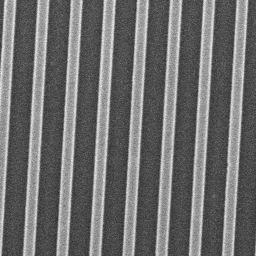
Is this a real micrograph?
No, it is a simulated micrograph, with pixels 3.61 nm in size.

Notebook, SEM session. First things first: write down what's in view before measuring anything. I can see parallel lines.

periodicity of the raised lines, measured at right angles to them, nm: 119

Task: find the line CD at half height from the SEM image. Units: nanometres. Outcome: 36.4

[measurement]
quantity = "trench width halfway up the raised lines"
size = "81.9 nanometers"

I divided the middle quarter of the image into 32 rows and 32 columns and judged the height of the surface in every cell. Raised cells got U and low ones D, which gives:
DUUDDDDDDUUUDDDDDDUUDDDDDDUUDDDD
DUUDDDDDDUUUDDDDDDUUDDDDDDUUDDDD
DUUDDDDDDUUUDDDDDUUUDDDDDDUUDDDD
DUUDDDDDDUUUDDDDDUUUDDDDDDUUDDDD
DUUDDDDDDUUUDDDDDUUUDDDDDDUUDDDD
DUUDDDDDDUUUDDDDDUUUDDDDDDUUDDDD
DUUDDDDDDUUDDDDDDUUUDDDDDDUUDDDD
DUUDDDDDDUUDDDDDDUUUDDDDDUUUDDDD
DUUDDDDDDUUDDDDDDUUUDDDDDUUUDDDD
DUUDDDDDDUUDDDDDDUUDDDDDDUUUDDDD
DUUDDDDDDUUDDDDDDUUDDDDDDUUUDDDD
UUUDDDDDDUUDDDDDDUUDDDDDDUUUDDDD
UUUDDDDDDUUDDDDDDUUDDDDDDUUUDDDD
UUUDDDDDDUUDDDDDDUUDDDDDDUUUDDDD
UUUDDDDDUUUDDDDDDUUDDDDDDUUUDDDD
UUUDDDDDUUUDDDDDDUUDDDDDDUUDDDDD
UUDDDDDDUUUDDDDDDUUDDDDDDUUDDDDD
UUDDDDDDUUUDDDDDUUUDDDDDDUUDDDDD
UUDDDDDDUUUDDDDDUUUDDDDDDUUDDDDD
UUDDDDDDUUUDDDDDUUUDDDDDDUUDDDDD
UUDDDDDDUUUDDDDDDUUDDDDDDUUDDDDD
UUDDDDDDUUUDDDDDUUUDDDDDDUUDDDDD
UUDDDDDDUUUDDDDDUUUDDDDDDUUDDDDD
UUDDDDDDUUDDDDDDUUUDDDDDDUUDDDDD
UUDDDDDDUUDDDDDDUUUDDDDDDUUDDDDD
UUDDDDDDUUDDDDDDUUUDDDDDUUUDDDDD
UUDDDDDDUUDDDDDDUUUDDDDDUUUDDDDD
UUDDDDDDUUDDDDDDUUDDDDDDUUUDDDDD
UUDDDDDDUUDDDDDDUUDDDDDDUUUDDDDD
UUDDDDDDUUDDDDDDUUDDDDDDUUUDDDDD
UUDDDDDDUUDDDDDDUUDDDDDDUUDDDDDD
UUDDDDDUUUDDDDDDUUDDDDDDUUDDDDDD